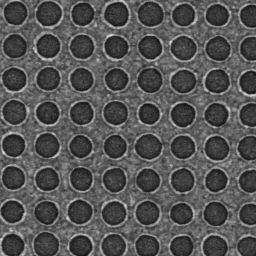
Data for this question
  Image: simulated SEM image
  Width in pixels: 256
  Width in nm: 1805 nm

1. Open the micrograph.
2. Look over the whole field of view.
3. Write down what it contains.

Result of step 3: a regular array of holes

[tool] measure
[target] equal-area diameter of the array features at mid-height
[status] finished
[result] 177 nanometres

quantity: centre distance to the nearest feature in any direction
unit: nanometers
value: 232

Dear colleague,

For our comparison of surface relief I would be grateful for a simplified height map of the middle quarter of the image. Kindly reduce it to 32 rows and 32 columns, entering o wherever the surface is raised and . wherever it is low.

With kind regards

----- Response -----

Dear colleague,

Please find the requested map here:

oooooooooooooooooooooooooooooooo
ooo...ooooo....ooooo...oooooo..o
o......oooo.....ooo.....ooo.....
o.......oo......oo.......oo.....
o.......oo......oo.......o......
oo.....oooo.....ooo.....ooo.....
ooo...oooooo...oooo.....oooo....
oooooooooooooooooooooooooooooo.o
oooooooooooooooooooooooooooooooo
ooo...oooooo..oooooooooooooooooo
oo.....ooo......ooo....oooo.....
o......ooo......ooo.....ooo.....
o......ooo......oo......oo......
oo.....ooo......ooo.....ooo.....
oo.....oooo....oooo....oooo.....
oooo.ooooooooooooooooooooooo...o
oooooooooooooooooooooooooooooooo
oooooooooooo.oooooooo.oooooooooo
oo....ooooo....oooo.....ooo.....
o......ooo......oo......ooo.....
o......ooo......o........o......
o......ooo......oo.......oo.....
oo.....ooo.....ooo......ooo.....
ooo..ooooooo..ooooo....ooooo...o
oooooooooooooooooooooooooooooooo
oooooooooooooooooooooooooooooooo
oo....ooooo....oooo....ooooo...o
oo.....ooo.....ooo......ooo.....
o......oo.......oo......oo......
oo.....oo.......oo......ooo.....
oo.....ooo......oo......ooo.....
ooo...ooooo....oooo....oooo.....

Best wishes